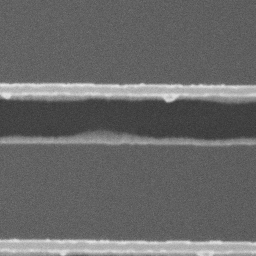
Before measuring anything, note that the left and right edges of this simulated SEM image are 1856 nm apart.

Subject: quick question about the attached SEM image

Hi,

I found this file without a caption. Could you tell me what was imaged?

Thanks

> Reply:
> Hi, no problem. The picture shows lines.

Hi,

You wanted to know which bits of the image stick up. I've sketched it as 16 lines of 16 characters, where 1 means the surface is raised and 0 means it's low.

1111111111111111
1111111111111111
1111111111111111
1111111111111111
1111111111111111
1111111111111111
0000000000000000
0000000000000000
0000000000000000
1111111111111111
1111111111111111
1111111111111111
1111111111111111
1111111111111111
1111111111111111
1111111111111111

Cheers